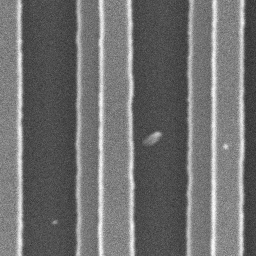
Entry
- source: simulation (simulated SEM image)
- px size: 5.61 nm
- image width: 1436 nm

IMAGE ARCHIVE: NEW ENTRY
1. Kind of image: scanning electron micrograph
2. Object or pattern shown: lines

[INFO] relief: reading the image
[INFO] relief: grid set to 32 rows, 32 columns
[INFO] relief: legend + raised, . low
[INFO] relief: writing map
+++.......++++++........++++++..
+++.......++++++........++++++..
++........++++++........++++++..
++........++++++........++++++..
++........++++++........++++++..
+++.......++++++........++++++..
+++.......++++++........++++++..
+++.......++++++........++++++..
+++.......++++++........++++++..
+++.......++++++........++++++..
+++.......++++++........++++++..
+++.......++++++........++++++..
+++.......++++++........++++++..
+++.......++++++........++++++..
+++.......++++++........++++++..
+++.......++++++........++++++..
+++.......++++++........++++++..
+++.......++++++........++++++..
+++.......++++++........++++++..
+++.......++++++........++++++..
+++.......++++++........++++++..
+++.......++++++........++++++..
+++.......+++++++.......++++++..
+++.......+++++++.......++++++..
+++.......++++++........++++++..
+++.......+++++++.......++++++..
+++.......++++++........++++++..
+++.......+++++++.......++++++..
+++.......+++++++.......++++++..
+++.......+++++++......+++++++..
+++.......+++++++.......++++++..
++........+++++++.......++++++..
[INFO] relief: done